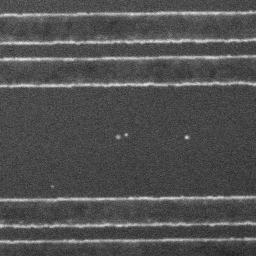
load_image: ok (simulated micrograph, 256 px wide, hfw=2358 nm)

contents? lines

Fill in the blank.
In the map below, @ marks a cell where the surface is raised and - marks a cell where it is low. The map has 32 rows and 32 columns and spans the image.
--------------------------------
--------------------------------
@@@@@@@@@@@@@@@@@@@@@@@@@@@@@@@@
@@@@@@@@@@@@@@@@@@@@@@@@@@@@@@@@
@@@@@@@@@@@@@@@@@@@@@@@@@@@@@@@@
--------------------------------
--------------------------------
@@@@@@@@@@@@@@@@@@@@@@@@@@@@@@@@
@@@@@@@@@@@@@@@@@@@@@@@@@@@@@@@@
@@@@@@@@@@@@@@@@@@@@@@@@@@@@@@@@
@@@@@@@@@@@@@@@@@@@@@@@@@@-@---@
--------------------------------
--------------------------------
--------------------------------
--------------------------------
--------------------------------
--------------------------------
--------------------------------
--------------------------------
--------------------------------
--------------------------------
--------------------------------
--------------------------------
--------------------------------
--------------------------------
@@@@@@@@@@@@@@@@@@@@@@@@@@@@@@@@
@@@@@@@@@@@@@@@@@@@@@@@@@@@@@@@@
@@@@@@@@@@@@@@@@@@@@@@@@@@@@@@@@
--------------------------------
--------------------------------
@@@@@@@@@@@@@@@@@@@@@@@@@@@@@@@@
@@@@@@@@@@@@@@@@@@@@@@@@@@@@@@@@